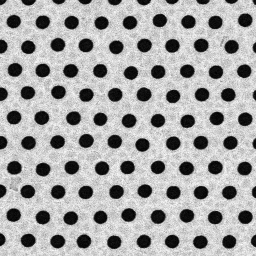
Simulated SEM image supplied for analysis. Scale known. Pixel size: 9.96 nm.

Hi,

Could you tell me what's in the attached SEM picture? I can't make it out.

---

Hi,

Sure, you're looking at a regular array of holes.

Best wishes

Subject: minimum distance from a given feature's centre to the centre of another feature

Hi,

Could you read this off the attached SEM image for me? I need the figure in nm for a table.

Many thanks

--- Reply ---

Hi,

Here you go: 268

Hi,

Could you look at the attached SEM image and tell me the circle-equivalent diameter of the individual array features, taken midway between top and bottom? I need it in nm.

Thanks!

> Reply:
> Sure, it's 137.